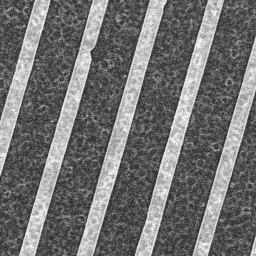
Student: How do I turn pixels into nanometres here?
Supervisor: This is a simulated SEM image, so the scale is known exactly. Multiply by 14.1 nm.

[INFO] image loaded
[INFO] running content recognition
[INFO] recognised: parallel lines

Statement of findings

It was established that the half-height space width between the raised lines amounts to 574 nanometers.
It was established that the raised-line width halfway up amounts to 14.5 pixels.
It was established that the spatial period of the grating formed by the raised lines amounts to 55.4 pixels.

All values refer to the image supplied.